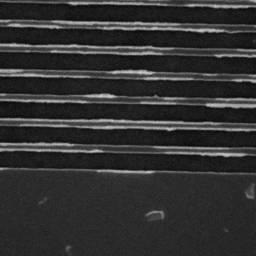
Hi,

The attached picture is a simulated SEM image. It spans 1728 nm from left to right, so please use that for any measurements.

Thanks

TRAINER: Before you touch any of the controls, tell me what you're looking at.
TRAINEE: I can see parallel lines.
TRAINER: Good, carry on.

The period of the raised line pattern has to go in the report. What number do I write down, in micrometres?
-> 0.167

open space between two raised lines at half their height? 0.117 µm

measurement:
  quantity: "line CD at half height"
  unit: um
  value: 0.0498